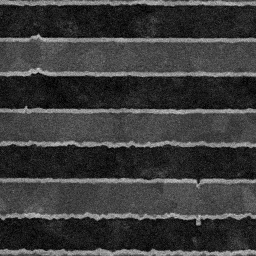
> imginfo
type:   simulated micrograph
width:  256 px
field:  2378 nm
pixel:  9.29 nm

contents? one or a few lines or trenches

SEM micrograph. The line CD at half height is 314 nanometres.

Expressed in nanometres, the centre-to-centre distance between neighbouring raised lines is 659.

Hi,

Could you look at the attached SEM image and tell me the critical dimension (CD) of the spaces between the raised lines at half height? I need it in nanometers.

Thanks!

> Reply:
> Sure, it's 343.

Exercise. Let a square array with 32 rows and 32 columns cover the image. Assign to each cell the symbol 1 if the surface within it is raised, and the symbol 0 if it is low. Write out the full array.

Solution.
00011001000000000000000000000000
00000000000000000000000000000000
00000000000000000000000000000000
00000000000000000000000000000000
00000000000000000000000000000000
11111111111111111111111111111111
11111111111111111111111111111111
11111111111111111111111111111111
11111111111111111111111111111111
00000000000000000000000000000000
00000000000000000000000000000000
00000000000000000000000000000000
00000000000000000000000000000000
00000000000000000000000000000000
11111111111111111111111111111111
11111111111111111111111111111111
11111111111111111111111111111111
11111111111111111111111111111111
00000000000000000000000000000000
00000000000000000000000000000000
00000000000000000000000000000000
00000000000000000000000000000000
11111000000000000000000000000000
11111111111111111111111111111111
11111111111111111111111111111111
11111111111111111111111111111111
11111111111111111111111111111111
00000000000000000000000010000000
00000000000000000000000000000000
00000000000000000000000000000000
00000000000000000000000000000000
11111101000000010000000000000011